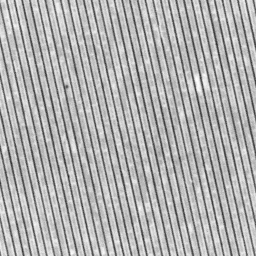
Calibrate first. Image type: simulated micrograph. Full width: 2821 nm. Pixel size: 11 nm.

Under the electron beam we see parallel lines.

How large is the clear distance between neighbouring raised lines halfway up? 22.8 nm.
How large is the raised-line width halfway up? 0.0606 µm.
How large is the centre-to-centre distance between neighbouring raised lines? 82.9 nanometers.